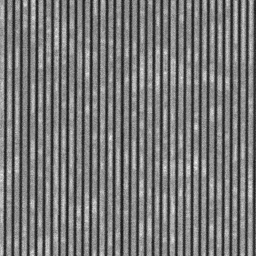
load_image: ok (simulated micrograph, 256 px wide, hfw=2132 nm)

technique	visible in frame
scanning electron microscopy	parallel lines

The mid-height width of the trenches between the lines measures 0.0229 µm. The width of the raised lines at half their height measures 0.0469 um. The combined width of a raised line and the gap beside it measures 7.79 pixels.